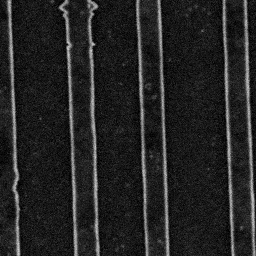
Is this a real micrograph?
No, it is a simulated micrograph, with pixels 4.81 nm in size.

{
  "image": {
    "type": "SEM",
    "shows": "one or a few lines or trenches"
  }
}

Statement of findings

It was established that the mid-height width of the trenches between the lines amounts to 270 nm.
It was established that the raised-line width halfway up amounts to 0.111 µm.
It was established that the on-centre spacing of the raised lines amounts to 376 nm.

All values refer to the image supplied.